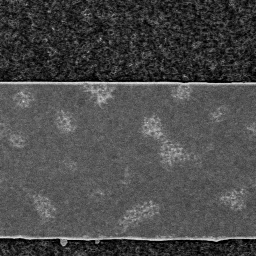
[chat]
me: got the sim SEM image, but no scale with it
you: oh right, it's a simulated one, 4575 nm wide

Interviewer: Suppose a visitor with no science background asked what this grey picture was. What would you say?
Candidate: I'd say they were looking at one or a few lines or trenches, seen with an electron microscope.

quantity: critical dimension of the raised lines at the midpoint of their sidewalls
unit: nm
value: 2790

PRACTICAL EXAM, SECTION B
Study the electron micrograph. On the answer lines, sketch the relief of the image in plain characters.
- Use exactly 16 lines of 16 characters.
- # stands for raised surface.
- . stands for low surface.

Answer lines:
................
................
................
................
................
################
################
################
################
################
################
################
################
################
################
................